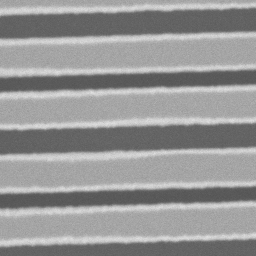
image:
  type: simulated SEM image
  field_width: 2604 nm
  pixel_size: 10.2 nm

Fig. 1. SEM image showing lines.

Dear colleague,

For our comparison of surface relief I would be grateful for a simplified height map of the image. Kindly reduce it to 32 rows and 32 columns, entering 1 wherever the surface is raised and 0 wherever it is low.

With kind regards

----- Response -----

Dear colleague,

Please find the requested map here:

11111111111111111111111111111111
11111111111100000000000000000000
00000000000000000000000000000000
00000000000000000000000000000000
00000000000000001111111111111111
11111111111111111111111111111111
11111111111111111111111111111111
11111111111111111111111111111111
11111111111111111111111111111111
11000000000000000000000000000000
00000000000000000000000000000000
01111111111111111111111111111111
11111111111111111111111111111111
11111111111111111111111111111111
11111111111111111111111111111111
11111111111111111111111101100000
00000000000000000000000000000000
00000000000000000000000000000000
00000000000000000000000000000000
11111111111111111111111111111111
11111111111111111111111111111111
11111111111111111111111111111111
11111111111111111111111111111111
11111111111111111111100100000000
00000000000000000000000000000000
00000000000000000000111111111111
11111111111111111111111111111111
11111111111111111111111111111111
11111111111111111111111111111111
11111111111111111111111111111111
11111100000000000000000000000000
00000000000000000000000000000000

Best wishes